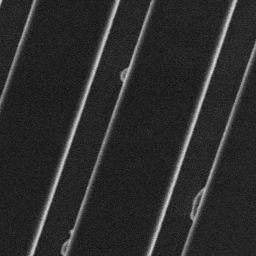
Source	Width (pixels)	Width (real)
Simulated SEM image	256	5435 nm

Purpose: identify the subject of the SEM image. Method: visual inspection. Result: lines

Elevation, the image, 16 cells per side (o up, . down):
..ooooo..oooooo.
..ooooo..ooooo..
.oooooo..ooooo..
.ooooo..oooooo..
.ooooo..ooooo..o
oooooo..ooooo..o
ooooo..oooooo..o
ooooo..ooooo..oo
ooooo..ooooo..oo
oooo..oooooo..oo
oooo..ooooo..ooo
oooo..ooooo..ooo
ooo..oooooo..ooo
ooo..ooooo..oooo
ooo..ooooo..oooo
oo..oooooo..oooo